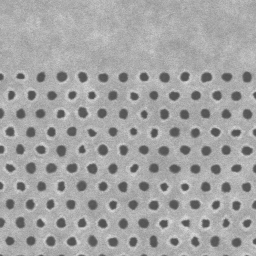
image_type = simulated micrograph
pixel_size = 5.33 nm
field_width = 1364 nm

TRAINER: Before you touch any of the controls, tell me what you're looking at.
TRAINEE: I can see a regular array of holes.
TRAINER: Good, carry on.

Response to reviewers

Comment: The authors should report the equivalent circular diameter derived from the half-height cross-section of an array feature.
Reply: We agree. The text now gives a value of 48.1 nm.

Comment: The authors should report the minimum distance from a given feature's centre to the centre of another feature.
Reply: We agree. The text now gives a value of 107 nm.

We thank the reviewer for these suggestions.